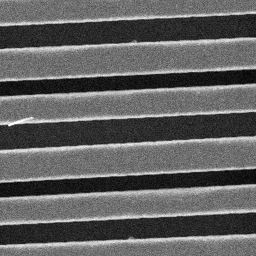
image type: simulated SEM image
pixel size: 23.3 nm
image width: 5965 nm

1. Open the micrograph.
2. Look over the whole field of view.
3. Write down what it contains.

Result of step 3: lines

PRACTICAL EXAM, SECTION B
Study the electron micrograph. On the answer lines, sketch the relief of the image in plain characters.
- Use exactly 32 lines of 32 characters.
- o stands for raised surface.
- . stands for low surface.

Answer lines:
oooooooooooooooooooooooooooooooo
oooooooooooooooooooooooooooooooo
ooooooooooooooo.................
................................
................................
...............ooooooooooooooooo
oooooooooooooooooooooooooooooooo
oooooooooooooooooooooooooooooooo
oooooooooooooooooooooooooooooooo
ooooooooooooooo.................
................................
.............ooooooooooooooooooo
oooooooooooooooooooooooooooooooo
oooooooooooooooooooooooooooooooo
oooooooooooooooooooo............
oo..............................
................................
.......................ooooooooo
......oooooooooooooooooooooooooo
oooooooooooooooooooooooooooooooo
oooooooooooooooooooooooooooooooo
oooooooooooooooooooooooo........
oooooo..........................
........................oooooooo
.....ooooooooooooooooooooooooooo
oooooooooooooooooooooooooooooooo
ooooooooooooooooooooooooooooooo.
ooooooooooo.....................
................................
..........................oooooo
...ooooooooooooooooooooooooooooo
oooooooooooooooooooooooooooooooo